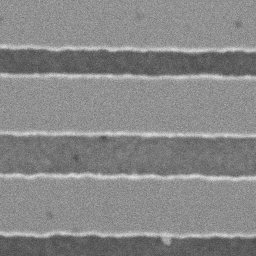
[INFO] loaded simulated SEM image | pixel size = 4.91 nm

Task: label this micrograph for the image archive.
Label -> lines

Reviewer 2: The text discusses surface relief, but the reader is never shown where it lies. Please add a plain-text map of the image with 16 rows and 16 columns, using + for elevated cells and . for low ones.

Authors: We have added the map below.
++++++++++++++++
++++++++++++++++
++++++++++++++++
................
................
++++++++++++++++
++++++++++++++++
++++++++++++++++
..........+.++++
................
................
++++++++++++++++
++++++++++++++++
++++++++++++++++
++++++++++++++++
................